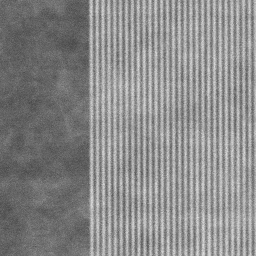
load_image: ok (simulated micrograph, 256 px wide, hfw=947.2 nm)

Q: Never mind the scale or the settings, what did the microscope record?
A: parallel lines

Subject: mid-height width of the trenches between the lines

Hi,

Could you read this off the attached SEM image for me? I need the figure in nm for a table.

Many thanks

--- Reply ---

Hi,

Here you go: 16.7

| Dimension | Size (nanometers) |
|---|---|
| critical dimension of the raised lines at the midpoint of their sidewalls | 5.6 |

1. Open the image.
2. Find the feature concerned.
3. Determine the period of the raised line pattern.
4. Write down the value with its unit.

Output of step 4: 21.7 nanometres